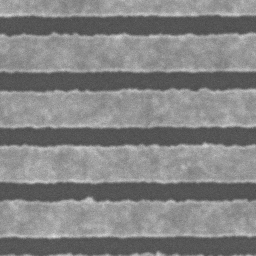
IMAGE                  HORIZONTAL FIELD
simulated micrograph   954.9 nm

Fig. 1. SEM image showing lines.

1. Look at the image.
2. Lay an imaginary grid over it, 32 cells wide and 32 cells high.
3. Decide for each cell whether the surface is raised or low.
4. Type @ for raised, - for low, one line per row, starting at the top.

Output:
@@@@@@@@@@@@@@@@@@@@@@@@@@@@@@@@
@@@@@@@@@@@@@@@@@@@@@@@@@@@@@@@@
--------------------------------
--------------------------------
@-@@--@@@@--@@@@@--@@@@@@@@@@@@@
@@@@@@@@@@@@@@@@@@@@@@@@@@@@@@@@
@@@@@@@@@@@@@@@@@@@@@@@@@@@@@@@@
@@@@@@@@@@@@@@@@@@@@@@@@@@@@@@@@
@@@@@@@@@@@@@@@@@@@@@@@@@@@@@@@@
--------------------------------
--------------------------------
@--@--@@-@@-@@@@@@@@@@@@@@@@@@@@
@@@@@@@@@@@@@@@@@@@@@@@@@@@@@@@@
@@@@@@@@@@@@@@@@@@@@@@@@@@@@@@@@
@@@@@@@@@@@@@@@@@@@@@@@@@@@@@@@@
@@@@@@@@@@@@@@@@@@@@@@@@@@@@@@@@
--------------------------------
--------------------------------
@@@@@@@@@@@@@@@@@@@@@@@@@@@@@@@@
@@@@@@@@@@@@@@@@@@@@@@@@@@@@@@@@
@@@@@@@@@@@@@@@@@@@@@@@@@@@@@@@@
@@@@@@@@@@@@@@@@@@@@@@@@@@@@@@@@
@@@@@@@@@@@@@@@@@@@@@@@@@@@@@@@@
--------------------------------
--------------------------------
@@@@@@@@@@@@@@@@@@@@@@@@@@@@@@@@
@@@@@@@@@@@@@@@@@@@@@@@@@@@@@@@@
@@@@@@@@@@@@@@@@@@@@@@@@@@@@@@@@
@@@@@@@@@@@@@@@@@@@@@@@@@@@@@@@@
@@@@@@@@@@@@@@@@@@@@@@--@@@@---@
--------------------------------
--------------------------------